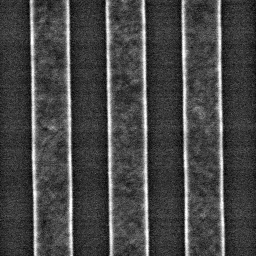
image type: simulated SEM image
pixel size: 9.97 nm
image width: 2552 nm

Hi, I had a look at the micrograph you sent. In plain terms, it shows wiring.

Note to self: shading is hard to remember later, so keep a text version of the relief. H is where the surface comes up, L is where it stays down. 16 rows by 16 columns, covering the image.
LLHHLLLHHLLHHHLL
LLHHLLLHHLLHHHLL
LLHHLLLHHLLHHHLL
LLHHLLLHHLLHHHLL
LLHHLLLHHLLHHHLL
LLHHLLLHHLLLHHLL
LLHHLLLHHLLLHHLL
LLHHLLLHHLLLHHLL
LLHHLLLHHLLLHHLL
LLHHLLLHHLLLHHLL
LLHHLLLHHLLLHHLL
LLHHLLLHHLLLHHLL
LLHHLLLHHLLLHHLL
LLHHLLLHHLLLHHLL
LLHHLLLHHLLLHHLL
LLHHLLLHHLLLHHLL